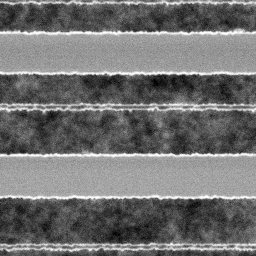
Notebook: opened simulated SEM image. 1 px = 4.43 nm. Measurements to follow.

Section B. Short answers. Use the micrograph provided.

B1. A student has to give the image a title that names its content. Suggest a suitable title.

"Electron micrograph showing lines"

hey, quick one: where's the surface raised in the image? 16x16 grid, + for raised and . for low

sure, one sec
................
................
++++++++++++++++
++++++++++++++++
++++++++++++++++
................
................
................
................
................
++++++++++++++++
++++++++++++++++
................
................
................
................